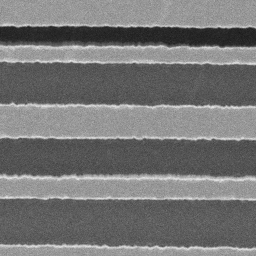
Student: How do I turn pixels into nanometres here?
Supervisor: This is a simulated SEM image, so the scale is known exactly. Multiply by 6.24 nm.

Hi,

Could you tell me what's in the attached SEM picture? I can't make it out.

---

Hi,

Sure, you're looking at lines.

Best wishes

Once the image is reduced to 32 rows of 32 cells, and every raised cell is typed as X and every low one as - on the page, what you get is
XXXXXXXXXXXXXXXXXXXXXXXXXXXXXXXX
XXXXXXXXXXXXXXXXXXXXXXXXXXXXXXXX
XXXXXXXXXXXXXXXXXXXXXXXXXXXXXXXX
--------------------------------
--------------------------------
--------------------------------
XXXXXXXXXXXXXXXXXXXXXXXXXXXXXXXX
XXXXXXXXXXXXXXXXXXXXXXXXXXXXXXXX
--------------------------------
--------------------------------
--------------------------------
--------------------------------
--------------------------------
XXXXXXXXXXXXXXXXXXXXXXXXXXXXXXXX
XXXXXXXXXXXXXXXXXXXXXXXXXXXXXXXX
XXXXXXXXXXXXXXXXXXXXXXXXXXXXXXXX
XXXXXXXXXXXXXXXXXXXXXXXXXXXXXXXX
--------------------------------
--------------------------------
--------------------------------
--------------------------------
--------------------------------
XXXXXXXXXXXXXXXXXXXXXXXXXXXXXXXX
XXXXXXXXXXXXXXXXXXXXXXXXXXXXXXXX
XXXXXXXXXXXXXXXXXXXXXXXXXXXXXXXX
--------------------------------
--------------------------------
--------------------------------
--------------------------------
--------------------------------
--------------------------------
XXXXXXXXXXXXXXXXXXXXXXXXXXXXXXXX